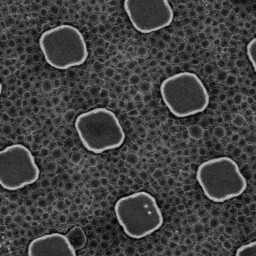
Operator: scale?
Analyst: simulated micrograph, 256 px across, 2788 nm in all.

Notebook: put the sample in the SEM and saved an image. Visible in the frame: raised bodies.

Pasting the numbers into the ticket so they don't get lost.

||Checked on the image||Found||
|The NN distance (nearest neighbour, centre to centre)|990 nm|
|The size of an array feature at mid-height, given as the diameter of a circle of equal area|474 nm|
